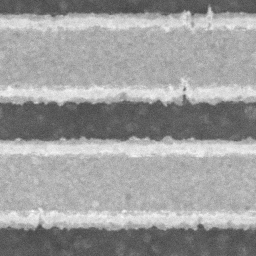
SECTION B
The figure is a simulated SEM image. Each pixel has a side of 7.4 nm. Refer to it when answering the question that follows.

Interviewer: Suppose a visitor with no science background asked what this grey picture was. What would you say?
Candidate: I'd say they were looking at one or a few lines or trenches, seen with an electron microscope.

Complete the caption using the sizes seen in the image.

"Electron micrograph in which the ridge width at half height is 0.516 µm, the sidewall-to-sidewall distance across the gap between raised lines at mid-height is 0.418 microns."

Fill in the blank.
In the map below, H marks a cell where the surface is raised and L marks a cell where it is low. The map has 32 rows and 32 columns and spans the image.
LLLLLLLLLLLLLLLLLLLLLLLLLLLLLLLL
LLLLLLLLLLLLLLLLLLLLLLLLLLLLLLLL
LLLLLLLLLLLLLLLLLLLLLLLLLLHLLLLL
HHHHHHHHHHHHHHHHHHHHHHHHHHHHHHHH
HHHHHHHHHHHHHHHHHHHHHHHHHHHHHHHH
HHHHHHHHHHHHHHHHHHHHHHHHHHHHHHHH
HHHHHHHHHHHHHHHHHHHHHHHHHHHHHHHH
HHHHHHHHHHHHHHHHHHHHHHHHHHHHHHHH
HHHHHHHHHHHHHHHHHHHHHHHHHHHHHHHH
HHHHHHHHHHHHHHHHHHHHHHHHHHHHHHHH
HHHHHHHHHHHHHHHHHHHHHHHHHHHHHHHH
HLHHHHHHHHHHHLLLHHHHHHHLHHHHHHLH
LLLLLLLLLLLLLLLLLLLLLLLLLLLLLLLL
LLLLLLLLLLLLLLLLLLLLLLLLLLLLLLLL
LLLLLLLLLLLLLLLLLLLLLLLLLLLLLLLL
LLLLLLLLLLLLLLLLLLLLLLLLLLLLLLLL
LLLLLLLLLLLLLLLLLLLLLLLLLLLLLLLL
LLLLLLLLLLLLLLLLLLLLLLLLLLLLLLLL
LLLLLLLLLLLLLLLLLLLLLLLLLLLLLLLL
HHHHHHHHHHHHHHHHHHHHHHHHHHHHHHHH
HHHHHHHHHHHHHHHHHHHHHHHHHHHHHHHH
HHHHHHHHHHHHHHHHHHHHHHHHHHHHHHHH
HHHHHHHHHHHHHHHHHHHHHHHHHHHHHHHH
HHHHHHHHHHHHHHHHHHHHHHHHHHHHHHHH
HHHHHHHHHHHHHHHHHHHHHHHHHHHHHHHH
HHHHHHHHHHHHHHHHHHHHHHHHHHHHHHHH
HHHHHHHHHHHHHHHHHHHHHHHHHHHHHHHH
LLLHLLLLLLLLLLLLLLLLLLLLLLLLLLLL
LLLLLLLLLLLLLLLLLLLLLLLLLLLLLLLL
LLLLLLLLLLLLLLLLLLLLLLLLLLLLLLLL
LLLLLLLLLLLLLLLLLLLLLLLLLLLLLLLL
LLLLLLLLLLLLLLLLLLLLLLLLLLLLLLLL